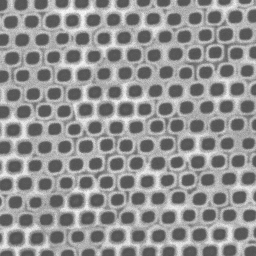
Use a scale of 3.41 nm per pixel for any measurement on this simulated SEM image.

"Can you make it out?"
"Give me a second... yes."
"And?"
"a regular array of holes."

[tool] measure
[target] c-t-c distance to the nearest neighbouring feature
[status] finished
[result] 67.6 nanometres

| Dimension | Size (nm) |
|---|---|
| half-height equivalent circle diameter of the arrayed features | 43.6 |